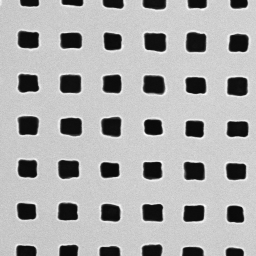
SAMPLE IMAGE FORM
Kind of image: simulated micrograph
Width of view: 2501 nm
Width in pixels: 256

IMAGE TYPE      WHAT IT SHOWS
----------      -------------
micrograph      a regular array of holes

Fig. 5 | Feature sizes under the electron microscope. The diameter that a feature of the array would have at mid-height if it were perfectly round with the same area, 190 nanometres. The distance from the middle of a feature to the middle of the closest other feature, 406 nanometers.